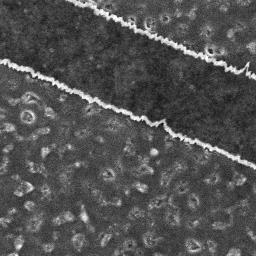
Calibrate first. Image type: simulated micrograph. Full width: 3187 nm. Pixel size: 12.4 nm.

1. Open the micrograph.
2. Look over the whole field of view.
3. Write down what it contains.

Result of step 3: one or a few lines or trenches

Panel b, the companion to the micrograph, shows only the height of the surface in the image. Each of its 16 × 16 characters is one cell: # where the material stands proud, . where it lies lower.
######..........
########........
##########......
#############...
..#############.
....############
......##########
.........#######
...........#####
..............##
................
................
................
................
................
................